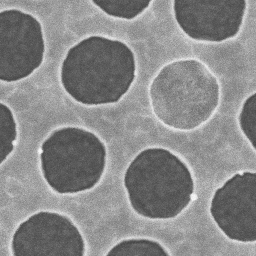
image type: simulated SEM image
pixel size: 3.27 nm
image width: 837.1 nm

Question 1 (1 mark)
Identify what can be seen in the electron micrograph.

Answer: holes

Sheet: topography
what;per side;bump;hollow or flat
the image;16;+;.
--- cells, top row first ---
++++++...++....+
..+++++++++....+
...++..++++++.++
...+....++++++++
..++....++++++++
++++....++++++++
+++++.+++++++++.
.++++++++++++++.
.++...+++++++++.
.++....++..+++++
+++...++....++++
+++...++....++..
++++++++....+...
++..+++++..++...
+....+++++++++..
+....++...++++++